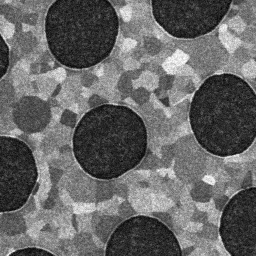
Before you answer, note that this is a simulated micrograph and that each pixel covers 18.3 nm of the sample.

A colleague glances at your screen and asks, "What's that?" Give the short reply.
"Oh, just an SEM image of holes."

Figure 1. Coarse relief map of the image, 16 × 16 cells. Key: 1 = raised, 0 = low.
1110000110000011
1110000111000011
1110000111111111
0110000111111111
1111111111111111
1111111111110000
1111111111110000
1111100001110000
1111100001110000
0011100001111001
0011100011111111
0011111111111111
0011111111111100
1111111111111100
1111111000011100
1111111000011100